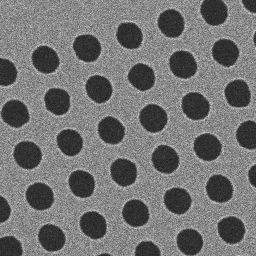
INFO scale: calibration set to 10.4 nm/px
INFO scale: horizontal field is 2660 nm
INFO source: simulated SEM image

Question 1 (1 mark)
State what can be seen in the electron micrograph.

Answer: a regular array of holes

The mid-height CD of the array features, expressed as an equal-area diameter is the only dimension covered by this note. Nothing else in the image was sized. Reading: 0.29 microns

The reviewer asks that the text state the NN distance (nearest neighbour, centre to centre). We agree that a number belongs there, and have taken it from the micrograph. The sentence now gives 446 nm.